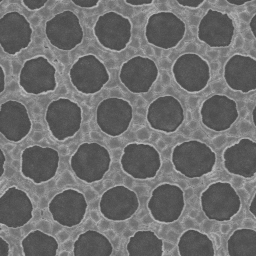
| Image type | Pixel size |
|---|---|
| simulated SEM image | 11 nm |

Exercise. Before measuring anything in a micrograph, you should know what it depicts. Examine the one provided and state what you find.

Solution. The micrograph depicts a regular array of holes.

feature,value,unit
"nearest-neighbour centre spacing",534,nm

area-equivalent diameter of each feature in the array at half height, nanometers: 411